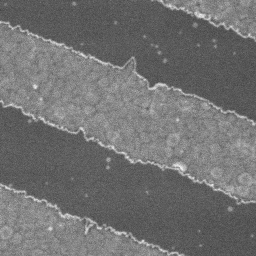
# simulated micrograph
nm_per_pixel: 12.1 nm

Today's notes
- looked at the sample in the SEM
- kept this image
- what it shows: one or a few lines or trenches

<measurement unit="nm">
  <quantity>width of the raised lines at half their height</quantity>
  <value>934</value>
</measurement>